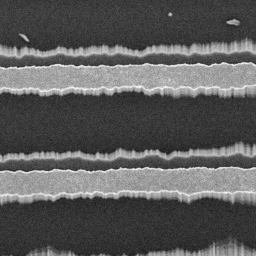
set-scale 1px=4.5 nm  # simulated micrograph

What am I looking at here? lines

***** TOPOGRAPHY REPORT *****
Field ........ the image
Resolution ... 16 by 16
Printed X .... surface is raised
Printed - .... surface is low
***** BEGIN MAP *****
----------------
----------------
----------------
XXXXXXXXXXXXXXXX
XXXXXXXXXXXXXXXX
XXXXXXXX-XXXXXXX
----------------
----------------
----------------
----------------
XXXXXXXXXXXXXXXX
XXXXXXXXXXXXXXXX
----------------
----------------
----------------
----------------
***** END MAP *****